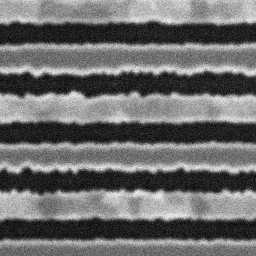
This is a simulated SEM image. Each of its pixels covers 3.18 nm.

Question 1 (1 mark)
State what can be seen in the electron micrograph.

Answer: lines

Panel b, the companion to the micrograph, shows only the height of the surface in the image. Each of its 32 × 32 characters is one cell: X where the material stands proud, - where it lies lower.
XXXXXXXXXXXXXXXXXXXXXXXXXXXXXXXX
XXXXXXXXXXXXXXXXXXXXXXXXXXXXXXXX
XXXXXXXXXXXXXXXXXXXXXXXXXXXXXXXX
--------------------------------
--------------------------------
--------------------------------
XXXXXXXXXXXXXXXXXXXXXXXXXXXXXXXX
XXXXXXXXXXXXXXXXXXXXXXXXXXXXXXXX
XXXXXXXXXXXXXXXXXXXXXXXXXXXXXXXX
--------------------------------
--------------------------------
--------------------------------
XXXXXXXXXXXXXXXXXXXXXXXXXXXXXXXX
XXXXXXXXXXXXXXXXXXXXXXXXXXXXXXXX
XXXXXXXXXXXXXXXXXXXXXXXXXXXXXXXX
--------------------------------
--------------------------------
--------------------------------
XXXXXXXXXXXXXXXXXXXXXXXXXXXXXXXX
XXXXXXXXXXXXXXXXXXXXXXXXXXXXXXXX
XXXXXXXXXXXXXXXXXXXXXXXXXXXXXXXX
--------------------------------
--------------------------------
--------------------------------
XXXXXXXXXXXXXXXXXXXXXXXXXXXXXXXX
XXXXXXXXXXXXXXXXXXXXXXXXXXXXXXXX
XXXXXXXXXXXXXXXXXXXXXXXXXXXXXXXX
--------------------------------
--------------------------------
--------------------------------
XXXXXXXXXXXXXXXXXXXXXXXXXXXXXXXX
XXXXXXXXXXXXXXXXXXXXXXXXXXXXXXXX